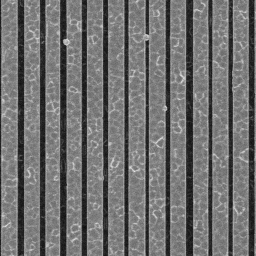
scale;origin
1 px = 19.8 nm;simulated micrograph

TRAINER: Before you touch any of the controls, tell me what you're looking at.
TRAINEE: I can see parallel lines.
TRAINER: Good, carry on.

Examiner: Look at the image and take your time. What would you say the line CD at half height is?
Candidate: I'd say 309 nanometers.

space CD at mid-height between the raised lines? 106 nanometres